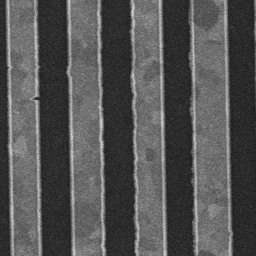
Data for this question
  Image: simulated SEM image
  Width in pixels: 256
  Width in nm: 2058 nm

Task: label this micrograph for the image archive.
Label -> one or a few lines or trenches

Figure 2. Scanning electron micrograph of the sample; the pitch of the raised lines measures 502 nanometres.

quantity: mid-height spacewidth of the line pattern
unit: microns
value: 0.276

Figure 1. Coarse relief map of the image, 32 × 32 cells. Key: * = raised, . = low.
.***.....***.....***....****....
.***.....***.....***....****....
.***.....***.....***....****....
.***.....***.....***....****....
.***.....***.....***....****....
.***.....***.....***....****....
.****....***.....***....****....
.****....***.....***....****....
.****....***.....***....****....
.***.....***.....***....****....
.***.....***.....***....****....
.***.....***.....***....****....
.***.....****....***....****....
.****....****....***....****....
.****....****....***....****....
.****....****....***....****....
.****....****....***....****....
.****....****....***....****....
.****....****....***....****....
.****....****....***....****....
.****....****....***....****....
.****....****....***....****....
.****....****....***.....***....
..***....****....***....****....
..***....****....***.....****...
..***....****....***.....****...
..***....****....***.....****...
..***....****....***.....****...
..***....****....***.....****...
..***....****....***.....****...
..***....****....****....****...
..***....****....****....****...